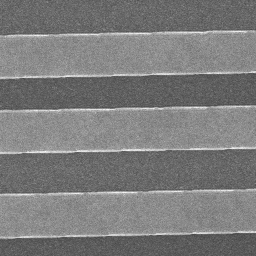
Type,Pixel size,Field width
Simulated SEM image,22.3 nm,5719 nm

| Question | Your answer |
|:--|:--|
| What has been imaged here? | lines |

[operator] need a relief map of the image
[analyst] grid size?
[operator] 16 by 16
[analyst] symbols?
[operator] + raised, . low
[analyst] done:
................
................
++++++++++++++++
++++++++++++++++
++++++++++++++++
................
................
++++++++++++++++
++++++++++++++++
++++............
................
................
++++++++++++++++
++++++++++++++++
++++++++++++++++
................